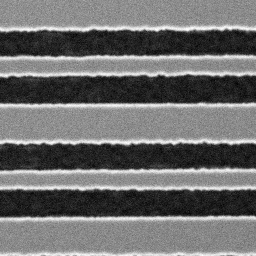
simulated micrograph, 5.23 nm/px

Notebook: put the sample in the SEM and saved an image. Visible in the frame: lines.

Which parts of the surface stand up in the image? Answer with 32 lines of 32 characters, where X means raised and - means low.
XXXXXXXXXXXXXXXXXXXXXXXXXXXXXXXX
XXXXXXXXXXXXXXXXXXXXXXXXXXXXXXXX
XXXXXXXXXXXXXXXXXXXXXXXXXXXXXXXX
XXXXXXXXXXXXXXXXXXXXXXXXXXXXXXXX
--------------------------------
--------------------------------
--------------------------------
XXXXXXXXXXXXXXXXXXXXXXXXXXXXXXXX
XXXXXXXXXXXXXXXXXXXXXXXXXXXXXXXX
X-X-XXXX---X---------X----------
--------------------------------
--------------------------------
--------------------------------
XXXXXXXXXXXXXXXXXXXXXXXXXXXXXXXX
XXXXXXXXXXXXXXXXXXXXXXXXXXXXXXXX
XXXXXXXXXXXXXXXXXXXXXXXXXXXXXXXX
XXXXXXXXXXXXXXXXXXXXXXXXXXXXXXXX
XXXXXXXXXXXXXXXXXXXXXXXXXXXXXXXX
--------------------------------
--------------------------------
--------------------------------
XXXXXXXXXXXXXXXXXXXXXXXXXXXXXXXX
XXXXXXXXXXXXXXXXXXXXXXXXXXXXXXXX
XXXXXXXXXXXXXXXXXXXXXXXXXXXXXXXX
--------------------------------
--------------------------------
--------------------------------
XXXXXXXXXXXXXXXXXXXXXXXXXXXXXXXX
XXXXXXXXXXXXXXXXXXXXXXXXXXXXXXXX
XXXXXXXXXXXXXXXXXXXXXXXXXXXXXXXX
XXXXXXXXXXXXXXXXXXXXXXXXXXXXXXXX
XXXXXXXXXXXXXXXXXXXXXXXXXXXXXXXX